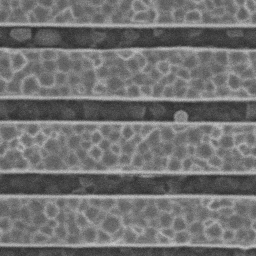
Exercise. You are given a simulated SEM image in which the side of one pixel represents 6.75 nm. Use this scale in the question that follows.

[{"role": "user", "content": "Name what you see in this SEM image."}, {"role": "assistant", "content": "one or a few lines or trenches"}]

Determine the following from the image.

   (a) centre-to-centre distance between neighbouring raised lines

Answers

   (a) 496 nm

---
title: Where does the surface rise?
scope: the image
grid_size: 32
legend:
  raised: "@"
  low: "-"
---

@@@@@@@@@@@@@@@@@@@@@@@@@@@@@@@@
@@@@@@@@@@@@@@@@@@@@@@@@@@@@@@@@
@@@@@@@@@@@@@@@@@@@@@@@@@@@@@@@@
--------------------------------
--------------------------------
--------------------------------
@@@@@@@@@@@@@@@@@@@@@@@@@@@@@@@@
@@@@@@@@@@@@@@@@@@@@@@@@@@@@@@@@
@@@@@@@@@@@@@@@@@@@@@@@@@@@@@@@@
@@@@@@@@@@@@@@@@@@@@@@@@@@@@@@@@
@@@@@@@@@@@@@@@@@@@@@@@@@@@@@@@@
@@@@@@@@@@@@@@@@@@@@@@@@@@@@@@@@
--------------------------------
--------------------------------
--------------------------------
@@@@@@@@@@@@@@@@@@@@@@@@@@@@@@@@
@@@@@@@@@@@@@@@@@@@@@@@@@@@@@@@@
@@@@@@@@@@@@@@@@@@@@@@@@@@@@@@@@
@@@@@@@@@@@@@@@@@@@@@@@@@@@@@@@@
@@@@@@@@@@@@@@@@@@@@@@@@@@@@@@@@
@@@@@@@@@@@@@@@@@@@@@@@@@@@@@@@@
-----------------@@@@@@@@@@@@@@@
--------------------------------
--------------------------------
--------------------------------
@@@@@@@@@@@@@@@@@@@@@@@@@@@@@@@@
@@@@@@@@@@@@@@@@@@@@@@@@@@@@@@@@
@@@@@@@@@@@@@@@@@@@@@@@@@@@@@@@@
@@@@@@@@@@@@@@@@@@@@@@@@@@@@@@@@
@@@@@@@@@@@@@@@@@@@@@@@@@@@@@@@@
@@@@@@@@@@@@@@@@@@@@@@@@@@@@@@@@
--------------------------------